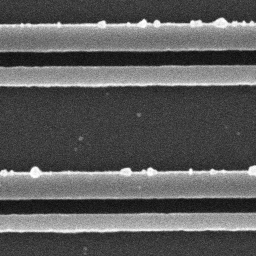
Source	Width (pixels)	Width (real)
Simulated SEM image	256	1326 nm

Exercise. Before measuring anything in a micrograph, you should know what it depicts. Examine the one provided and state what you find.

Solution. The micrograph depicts lines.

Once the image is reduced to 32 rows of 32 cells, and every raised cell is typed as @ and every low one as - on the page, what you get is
--------------------------------
--------------------------------
---------------------------@----
@@@@@@@@@@@@@@@@@@@@@@@@@@@@@@@@
@@@@@@@@@@@@@@@@@@@@@@@@@@@@@@@@
@@@@@@@@@@@@@@@@@@@@@@@@@@@@@@@@
--------------------------------
--------------------------------
@@@@@@@@@@@@@@@@@@@@@@@@@@@@@@@@
@@@@@@@@@@@@@@@@@@@@@@@@@@@@@@@@
@@@@@@@@@@@@@@@@@@@-@@@@@@-@----
--------------------------------
--------------------------------
--------------------------------
--------------------------------
--------------------------------
--------------------------------
--------------------------------
--------------------------------
--------------------------------
--------------------------------
@@-@@---@------@@@@@---@--@@@@@@
@@@@@@@@@@@@@@@@@@@@@@@@@@@@@@@@
@@@@@@@@@@@@@@@@@@@@@@@@@@@@@@@@
@@@@@@@@@@@@@@@@@@@@@@@@@@@@@@@@
--------------------------------
--------------------------------
@@@@@@@@@@@@@@@@@@@@@@@@@@@@@@@@
@@@@@@@@@@@@@@@@@@@@@@@@@@@@@@@@
--------------------------------
--------------------------------
--------------------------------